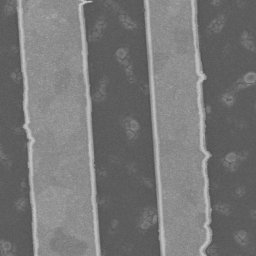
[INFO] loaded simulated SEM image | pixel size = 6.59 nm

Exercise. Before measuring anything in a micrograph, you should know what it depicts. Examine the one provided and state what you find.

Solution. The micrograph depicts one or a few lines or trenches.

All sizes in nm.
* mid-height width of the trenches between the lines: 435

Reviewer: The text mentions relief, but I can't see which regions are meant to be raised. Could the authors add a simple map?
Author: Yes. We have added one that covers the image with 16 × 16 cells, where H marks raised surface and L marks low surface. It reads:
LHHHHLLLLHHHLLLL
LHHHHLLLLHHHLLLL
LHHHHLLLLHHHLLLL
LHHHHLLLLHHHLLLL
LLHHHLLLLHHHLLLL
LLHHHLLLLLHHLLLL
LLHHHHLLLLHHLLLL
LLHHHHLLLLHHHLLL
LLHHHHLLLLHHHLLL
LLHHHHLLLLHHHLLL
LLHHHHLLLLHHHLLL
LLHHHHLLLLHHHLLL
LLHHHHLLLLHHHLLL
LLHHHHLLLLHHHLLL
LLHHHHLLLLHHHLLL
LLHHHHLLLLHHHLLL